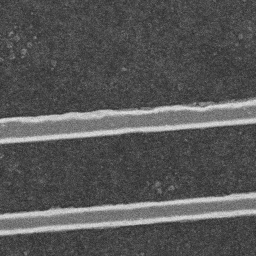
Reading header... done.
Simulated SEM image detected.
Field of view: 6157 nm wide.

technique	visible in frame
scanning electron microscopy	one or a few lines or trenches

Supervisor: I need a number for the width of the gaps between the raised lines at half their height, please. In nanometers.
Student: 1790